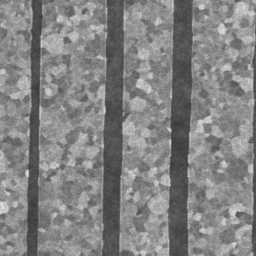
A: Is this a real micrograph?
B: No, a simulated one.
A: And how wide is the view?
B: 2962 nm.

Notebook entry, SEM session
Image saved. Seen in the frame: one or a few lines or trenches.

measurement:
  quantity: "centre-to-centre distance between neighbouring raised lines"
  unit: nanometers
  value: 865